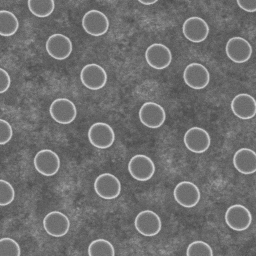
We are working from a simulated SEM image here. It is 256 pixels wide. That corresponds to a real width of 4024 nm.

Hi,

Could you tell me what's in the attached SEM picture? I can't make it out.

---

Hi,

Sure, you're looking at a regular array of raised bodies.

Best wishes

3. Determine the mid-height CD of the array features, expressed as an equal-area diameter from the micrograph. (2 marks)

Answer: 389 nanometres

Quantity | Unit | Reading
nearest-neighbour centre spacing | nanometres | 719